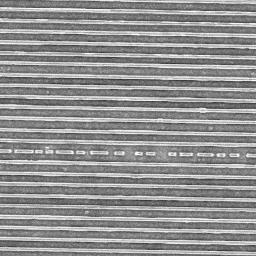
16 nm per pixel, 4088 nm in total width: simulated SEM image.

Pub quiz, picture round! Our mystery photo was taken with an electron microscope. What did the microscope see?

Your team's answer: parallel lines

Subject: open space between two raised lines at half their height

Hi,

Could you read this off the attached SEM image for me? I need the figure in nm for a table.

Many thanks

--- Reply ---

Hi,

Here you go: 138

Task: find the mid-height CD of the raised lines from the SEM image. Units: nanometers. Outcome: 41.9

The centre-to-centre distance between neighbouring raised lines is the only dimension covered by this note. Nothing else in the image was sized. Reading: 174 nanometers